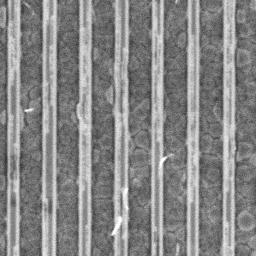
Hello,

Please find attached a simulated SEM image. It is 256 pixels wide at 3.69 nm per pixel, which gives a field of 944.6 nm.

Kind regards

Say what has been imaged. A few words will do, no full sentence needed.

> parallel lines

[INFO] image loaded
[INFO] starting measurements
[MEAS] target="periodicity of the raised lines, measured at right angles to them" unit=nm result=133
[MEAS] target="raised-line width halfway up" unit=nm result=33.2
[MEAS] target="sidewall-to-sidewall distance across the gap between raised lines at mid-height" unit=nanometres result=98.3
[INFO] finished